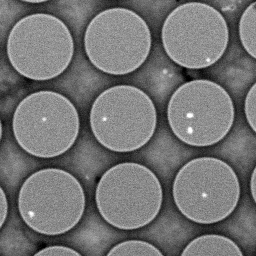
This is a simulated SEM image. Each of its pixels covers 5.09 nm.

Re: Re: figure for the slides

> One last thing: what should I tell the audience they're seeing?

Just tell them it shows an array of small figures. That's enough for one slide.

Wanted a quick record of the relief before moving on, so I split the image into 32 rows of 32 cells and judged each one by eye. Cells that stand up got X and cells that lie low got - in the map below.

------------------------X-------
-------------XXX------XXXXX----X
---XXXX-----XXXXXX---XXXXXXX--XX
--XXXXXX---XXXXXXX--XXXXXXXX--XX
-XXXXXXXX--XXXXXXXX-XXXXXXXX--XX
-XXXXXXXX--XXXXXXXX-XXXXXXXX--XX
-XXXXXXXX--XXXXXXXX--XXXXXXX---X
-XXXXXXXX--XXXXXXX----XXXXX-----
--XXXXXX----XXXXX---------------
---XXXX-------------------------
-----------------------XXXX-----
-----X-------XXXXX----XXXXXX---X
---XXXXX----XXXXXXX--XXXXXXXX--X
--XXXXXXX---XXXXXXX--XXXXXXXX--X
--XXXXXXXX-XXXXXXXX--XXXXXXXX--X
--XXXXXXXX-XXXXXXXX--XXXXXXXX--X
--XXXXXXXX--XXXXXXX---XXXXXX----
--XXXXXXX---XXXXXX-----XXXX-----
---XXXXXX-----XXX---------------
-----XX-------------------------
----------------X------XXXXX----
-----XXX-----XXXXXX---XXXXXXX---
---XXXXXX----XXXXXXX--XXXXXXXX-X
---XXXXXXX--XXXXXXXX--XXXXXXXX-X
X-XXXXXXXX--XXXXXXXX--XXXXXXXX--
X-XXXXXXXXX-XXXXXXXX--XXXXXXX---
X--XXXXXXX---XXXXXXX---XXXXXX---
X--XXXXXXX---XXXXXX-----XXX-----
----XXXXX------XX---------------
--------------------------X-----
---------------XXXX-----XXXXX---
-----XXXX-----XXXXXX---XXXXXXX--